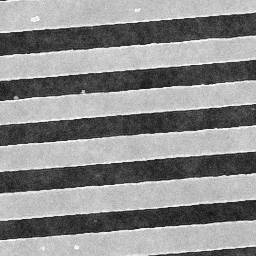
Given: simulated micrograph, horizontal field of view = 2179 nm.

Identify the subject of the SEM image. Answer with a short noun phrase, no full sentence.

lines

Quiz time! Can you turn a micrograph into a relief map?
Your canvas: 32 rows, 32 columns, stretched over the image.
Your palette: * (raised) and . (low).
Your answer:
********************************
********************************
********************............
********........................
................................
...................*************
.......*************************
*******************************.
*******************.............
********........................
...........................*****
...............*****************
..******************************
**************************......
*************...................
*...............................
.......................*********
.........***********************
********************************
************************........
************....................
................................
......................**********
..........**********************
********************************
*************************.......
*************...................
*...............................
...................*************
.......*************************
********************************
***********************.........